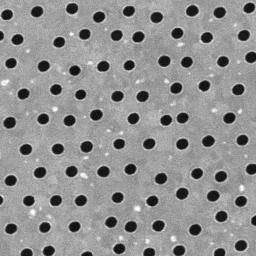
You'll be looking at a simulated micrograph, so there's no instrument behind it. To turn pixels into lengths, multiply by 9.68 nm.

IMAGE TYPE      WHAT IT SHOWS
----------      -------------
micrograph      a regular array of holes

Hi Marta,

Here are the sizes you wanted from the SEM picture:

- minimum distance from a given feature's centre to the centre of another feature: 25.9 px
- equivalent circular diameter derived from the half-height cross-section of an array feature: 115 nanometres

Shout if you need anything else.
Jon